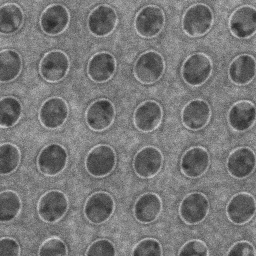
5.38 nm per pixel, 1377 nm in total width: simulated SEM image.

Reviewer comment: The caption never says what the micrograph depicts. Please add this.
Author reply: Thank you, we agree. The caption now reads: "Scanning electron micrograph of a regular array of raised bodies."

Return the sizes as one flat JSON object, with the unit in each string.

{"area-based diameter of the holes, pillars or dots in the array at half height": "0.166 microns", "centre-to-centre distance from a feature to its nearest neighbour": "248 nanometres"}